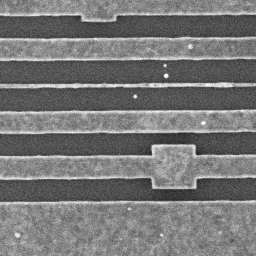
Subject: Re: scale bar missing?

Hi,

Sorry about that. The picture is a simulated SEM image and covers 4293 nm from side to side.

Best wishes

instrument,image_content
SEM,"wiring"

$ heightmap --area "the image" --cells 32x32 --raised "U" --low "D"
UUUUUUUUUUUUUUUUUUUUUUUUUUUUUUUU
UUUUUUUUUUUUUUUUUUUUUUUUUUUUUUUU
DDDDDDDDDDUUUUDDDDDDDDDDDDDDDDDD
DDDDDDDDDDDDDDDDDDDDDDDDDDDDDDDD
DDDDDDDDDDDDDDDDDDDDDDDDDDDDDDDD
UUUUUUUUUUUUUUUUUUUUUUUUUUUUUUUU
UUUUUUUUUUUUUUUUUUUUUUUUUUUUUUUU
UUUUUUUDDDUDDDDDDDDDDDDDDDDDDDDD
DDDDDDDDDDDDDDDDDDDDDDDDDDDDDDDD
DDDDDDDDDDDDDDDDDDDDDDDDDDDDDDDD
DDDDDDDDDDDDDDDDDDDDDDDDDDDDDDDD
DDDDDDDDDDDDDDDDDDDDDDDDDDDDDDDD
DDDDDDDDDDDDDDDDDDDDDDDDDDDDDDDD
DDDDDDDDDDDDDDDDDDDDDDDDDDDDDDDD
UUUUUUUUUUUUUUUUUUUUUUUUUUUUUUUU
UUUUUUUUUUUUUUUUUUUUUUUUUUUUUUUU
UUUUUUUUUUUUUUUUUUUUUUUDUUUDDDDD
DDDDDDDDDDDDDDDDDDDDDDDDDDDDDDDD
DDDDDDDDDDDDDDDDDDDUUUUUDDDDDDDD
DDDDDDDDDDDDDDDDDDDUUUUUUUUDUUUU
UUUUUUUUUUUUUUUUUUUUUUUUUUUUUUUU
UUUUUUUUUUUUUUUUUUUUUUUUUUUUUUUU
DDDDDDDDDDDDDDDDDDDUUUUUUDDDDDDD
DDDDDDDDDDDDDDDDDDDUUUUUDDDDDDDD
DDDDDDDDDDDDDDDDDDDDDDDDDDDDDDDD
UUUUUUUUUUUUUUUUUUUUUUUUUUUUUUUU
UUUUUUUUUUUUUUUUUUUUUUUUUUUUUUUU
UUUUUUUUUUUUUUUUUUUUUUUUUUUUUUUU
UUUUUUUUUUUUUUUUUUUUUUUUUUUUUUUU
UUUUUUUUUUUUUUUUUUUUUUUUUUUUUUUU
UUUUUUUUUUUUUUUUUUUUUUUUUUUUUUUU
UUUUUUUUUUUUUUUUUUUUUUUUUUUUUUUU